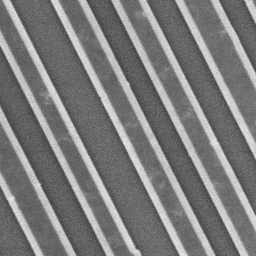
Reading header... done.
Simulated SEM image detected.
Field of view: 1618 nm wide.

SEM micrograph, one or a few lines or trenches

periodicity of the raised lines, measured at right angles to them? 380 nm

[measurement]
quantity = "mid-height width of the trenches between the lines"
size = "200 nm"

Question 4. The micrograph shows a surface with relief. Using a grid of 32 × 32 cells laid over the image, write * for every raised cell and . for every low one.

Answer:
*......****....***.....****....*
**......***....****....*****....
**......****....***.....****....
***......***....****....*****...
***......****....***.....****...
****.....****....****....*****..
.***......****....***.....****..
.****.....****....****....*****.
..***......****....***.....****.
..****.....****....****....*****
...***......****....***.....****
...****......***....****....****
....***......****....***.....***
....****......***....****....***
.....***......****....***.....**
*....****......***....****....**
*.....***......****....***.....*
**....****......***....****....*
**.....***......****....***.....
***....****......***....****....
***.....***......****....***....
****....****......***....****...
****.....***......****....***...
.****....****......***....****..
.****.....***......****....***..
..****....****......***....****.
..****.....***......****....***.
...****.....***......***....****
...****.....***......****....***
....****.....***......***....***
....****.....***......****....**
.....****.....***......***....**